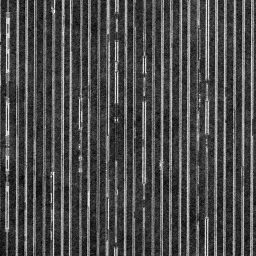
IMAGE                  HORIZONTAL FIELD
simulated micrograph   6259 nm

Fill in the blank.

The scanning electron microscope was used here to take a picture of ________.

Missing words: parallel lines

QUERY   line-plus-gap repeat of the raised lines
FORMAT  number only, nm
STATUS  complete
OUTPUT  222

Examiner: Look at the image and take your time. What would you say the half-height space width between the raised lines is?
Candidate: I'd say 174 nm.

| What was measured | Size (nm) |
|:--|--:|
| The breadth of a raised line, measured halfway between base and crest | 39.7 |